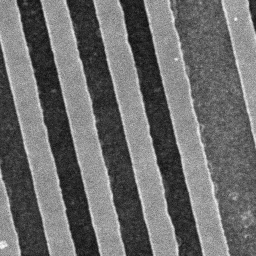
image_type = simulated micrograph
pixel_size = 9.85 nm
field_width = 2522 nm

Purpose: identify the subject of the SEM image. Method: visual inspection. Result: lines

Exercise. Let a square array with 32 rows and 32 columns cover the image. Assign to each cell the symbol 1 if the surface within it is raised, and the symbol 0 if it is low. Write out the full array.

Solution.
11000111000011100011100000001110
11000111100011100011100000001110
11100011100011110011110000001110
11100011100001110001110000000111
11100011100001110001110000000111
11100011110001110001110000000111
11110001110001111001111000000111
01110001110001111000111000000111
01110001110000111000111000000011
01110001111000111000111000000011
01111000111000111000111100000011
00111000111000111100011100000011
00111000111000011100011100000001
00111000111100011100011100000001
00111000111100011100011100000001
00111100011100011110001110000001
00011100011100001110001110000000
00011100011100001110001110000000
00011100011110001110001110000000
00011110001110001110000111000000
00001110001110000111000111000000
00001110001110000111000111000000
00001110001111000111000111000000
10001111000111000111000111100000
10000111000111000011100011100000
10000111000111000011100011100000
10000111000111100011100011100000
11000111000111100011100011110000
11000111100011100011110001110000
11000011100011100001110001110000
11000011100011100001110001110000
11000011100011110001110001111000